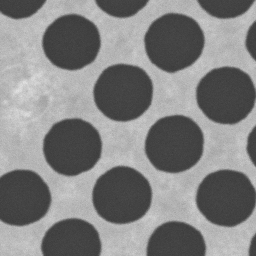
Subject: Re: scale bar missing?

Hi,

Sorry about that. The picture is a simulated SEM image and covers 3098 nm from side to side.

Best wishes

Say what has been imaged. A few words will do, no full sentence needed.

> holes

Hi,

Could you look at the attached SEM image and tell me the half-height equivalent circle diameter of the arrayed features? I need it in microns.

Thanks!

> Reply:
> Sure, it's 0.716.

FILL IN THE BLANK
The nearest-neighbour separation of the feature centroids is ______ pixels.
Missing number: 71.2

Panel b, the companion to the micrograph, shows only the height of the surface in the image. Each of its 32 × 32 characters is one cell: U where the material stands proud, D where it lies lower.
DDDDDDUUUUUUDDDDDDUUUUUUUDDDDDDD
DDDDDUUUUUUUUDDDDUUUUUUUUUDDDDDU
UUUUUUUDDDDUUUUUUUUDDDDDUUUUUUUU
UUUUUUDDDDDDUUUUUUUDDDDDDUUUUUUD
UUUUUDDDDDDDUUUUUUDDDDDDDDUUUUUD
UUUUUDDDDDDDDUUUUUDDDDDDDDUUUUUD
UUUUUDDDDDDDUUUUUUDDDDDDDUUUUUUD
UUUUUUDDDDDDUUUUUUUDDDDDDUUUUUUU
UUUUUUUDDDUUUDDDDDUUDDDUUUUDDDUU
UUUUUUUUUUUUDDDDDDDUUUUUUUDDDDDU
UUUUUUUUUUUUDDDDDDDUUUUUUDDDDDDD
UUUUUUUUUUUUDDDDDDDUUUUUUDDDDDDD
UUUUUUUUUUUUDDDDDDDUUUUUUDDDDDDD
UUUUUUUUUUUUDDDDDDDUUUUUUDDDDDDD
UUUUUUUUUUUUUDDDDUUUUDDUUUDDDDDU
UUUUUUUDDDDUUUUUUUUDDDDDDUUUDUUU
UUUUUUDDDDDDUUUUUUUDDDDDDUUUUUUD
UUUUUDDDDDDDDUUUUUDDDDDDDUUUUUUD
UUUUUDDDDDDDDUUUUUDDDDDDDUUUUUUD
UUUUUUDDDDDDDUUUUUDDDDDDDUUUUUUD
UUUUUUDDDDDDUUUUUUUDDDDDDUUUUUUU
UDDDUUUDDDDUUDDDDUUUUDDUUUUDDDUU
DDDDDUUUUUUUDDDDDDUUUUUUUDDDDDDU
DDDDDDUUUUUUDDDDDDDUUUUUUDDDDDDD
DDDDDDUUUUUUDDDDDDDUUUUUUDDDDDDD
DDDDDDUUUUUUDDDDDDDUUUUUUDDDDDDD
DDDDDDUUUUUUDDDDDDUUUUUUUDDDDDDD
DDDDDUUUDDUUUDDDDUUUUUUUUUDDDDDU
UUUUUUDDDDDDUUUUUUUUDDDDUUUUUUUU
UUUUUDDDDDDDUUUUUUUDDDDDDUUUUUUU
UUUUUDDDDDDDDUUUUUDDDDDDDDUUUUUD
UUUUUDDDDDDDDUUUUUDDDDDDDDUUUUUD